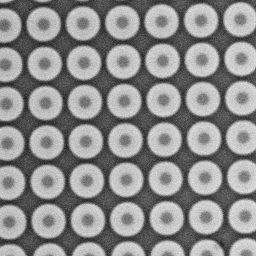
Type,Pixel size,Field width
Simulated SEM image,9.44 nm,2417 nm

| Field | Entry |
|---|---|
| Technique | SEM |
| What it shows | an array of small figures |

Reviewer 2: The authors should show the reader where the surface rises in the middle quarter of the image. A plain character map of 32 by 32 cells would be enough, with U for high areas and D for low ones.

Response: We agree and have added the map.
DUUUUUUUUDDUUUUUUUUDDUUUUUUUUDDU
DUUUUUUUUDDUUUUUUUDDDUUUUUUUDDDU
DDUUUUUUDDDDUUUUUUDDDDUUUUUDDDDD
DDDUUUUDDDDDDDUUDDDDDDDDDDDDDDDD
DDDDDDDDDDDDDDDDDDDDDDDDDDDDDDDD
DDDDUUDDDDDDDUUUUDDDDDDUUUUDDDDD
DDUUUUUUDDDDUUUUUUDDDDUUUUUUDDDU
DDUUUUUUUDDUUUUUUUUDDUUUUUUUUDDU
DUUUUUUUUDDUUUUUUUUDDUUUUUUUUDDU
DUUUUUUUUDDUUUUUUUUDDUUUUUUUUDDU
DUUUUUUUUDDUUUUUUUUDDUUUUUUUUDDU
DDUUUUUUUDDUUUUUUUUDDDUUUUUUDDDD
DDUUUUUUDDDDUUUUUUDDDDDUUUUDDDDD
DDDDUUUDDDDDDDDDDDDDDDDDDDDDDDDD
DDDDDDDDDDDDDDDDDDDDDDDDDDDDDDDD
DDDDUUUDDDDDDUUUUUDDDDDUUUUDDDDD
DDUUUUUUDDDDUUUUUUUDDDUUUUUUUDDU
DDUUUUUUUDDUUUUUUUUDDUUUUUUUUDDU
DUUUUUUUUUDUUUUUUUUDDUUUUUUUUDDU
DUUUUUUUUUDUUUUUUUUDDUUUUUUUUDDU
DUUUUUUUUDDUUUUUUUUDDUUUUUUUUDDU
DDUUUUUUUDDDUUUUUUUDDDUUUUUUDDDD
DDDUUUUUDDDDDUUUUUDDDDDUUUUDDDDD
DDDDDUDDDDDDDDDDDDDDDDDDDDDDDDDD
DDDDDDDDDDDDDDDDDDDDDDDDDDDDDDDD
DDDDUUUUDDDDDUUUUUDDDDDUUUUUDDDD
DDUUUUUUUDDDUUUUUUUDDDUUUUUUUDDD
DDUUUUUUUUDDUUUUUUUDDUUUUUUUUDDU
DDUUUUUUUUDUUUUUUUUUDUUUUUUUUDDU
DDUUUUUUUUDUUUUUUUUUDUUUUUUUUDDU
DDUUUUUUUUDDUUUUUUUDDDUUUUUUUDDD
DDUUUUUUUDDDUUUUUUUDDDUUUUUUDDDD